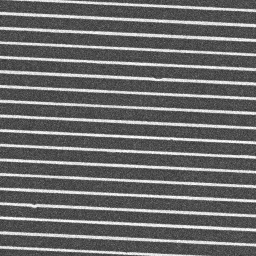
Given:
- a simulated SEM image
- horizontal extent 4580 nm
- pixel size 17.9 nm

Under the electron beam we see parallel lines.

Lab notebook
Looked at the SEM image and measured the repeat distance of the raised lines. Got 262 nm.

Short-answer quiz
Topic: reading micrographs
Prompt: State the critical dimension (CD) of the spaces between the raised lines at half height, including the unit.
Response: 217 nm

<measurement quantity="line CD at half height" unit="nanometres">49.2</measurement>